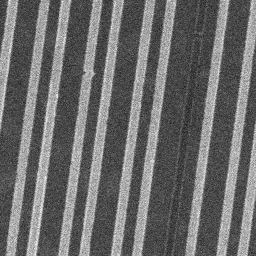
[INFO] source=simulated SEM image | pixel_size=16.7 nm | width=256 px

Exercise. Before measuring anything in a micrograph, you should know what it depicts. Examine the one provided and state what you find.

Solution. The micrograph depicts parallel lines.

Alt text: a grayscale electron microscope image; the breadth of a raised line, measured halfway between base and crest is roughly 124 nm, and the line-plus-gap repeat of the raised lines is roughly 435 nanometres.